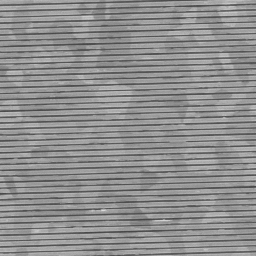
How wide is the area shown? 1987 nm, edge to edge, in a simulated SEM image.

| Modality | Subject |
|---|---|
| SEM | parallel lines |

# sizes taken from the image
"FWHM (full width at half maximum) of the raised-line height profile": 0.0281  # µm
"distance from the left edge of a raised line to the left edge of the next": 45.7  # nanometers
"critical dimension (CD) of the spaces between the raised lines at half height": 1.87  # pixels